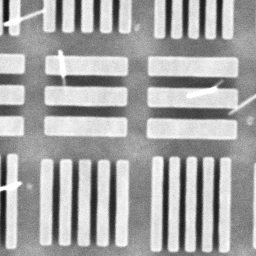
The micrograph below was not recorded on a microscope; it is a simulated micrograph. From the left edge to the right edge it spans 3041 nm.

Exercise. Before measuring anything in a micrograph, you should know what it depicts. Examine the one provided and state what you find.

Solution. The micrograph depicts groups of lines, slits or small figures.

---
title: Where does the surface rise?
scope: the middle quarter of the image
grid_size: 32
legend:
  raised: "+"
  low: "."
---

++++++++++++++++.....+++++++++++
++++++++++++++++.....+++++++++++
...++..++++++++......+++++++++++
................................
................................
................................
++++++++++++++++.....+++++++++++
++++++++++++++++.....+++++++++++
++++++++++++++++.....+++++++++++
++++++++++++++++.....+++++++++++
.....................+++++++++++
................................
................................
+++++++++++.....................
++++++++++++++++.....+++++++++++
++++++++++++++++.....+++++++++++
+++++++++++++++......+++++++++++
+++++++++++++++......+++++++++++
................................
................................
................................
................................
................................
.......................+........
++..++...++..+++......+++..++..+
++..++...++..+++......+++..++..+
++..++...++..+++......+++..++..+
++..++...++..+++......+++..++..+
++..++...++..+++......+++..++..+
++..++...++..+++......+++..++..+
++..++...++..+++......+++.+++..+
++..++...++..+++......+++.+++..+